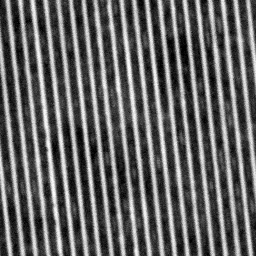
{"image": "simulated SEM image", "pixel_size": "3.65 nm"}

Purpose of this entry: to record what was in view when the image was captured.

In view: parallel lines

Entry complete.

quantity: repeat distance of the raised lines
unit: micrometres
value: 0.046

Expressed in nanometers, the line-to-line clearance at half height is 32.2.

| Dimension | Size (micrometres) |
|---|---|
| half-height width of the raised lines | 0.0109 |